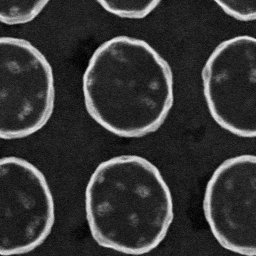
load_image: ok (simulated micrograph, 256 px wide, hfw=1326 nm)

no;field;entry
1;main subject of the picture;raised bodies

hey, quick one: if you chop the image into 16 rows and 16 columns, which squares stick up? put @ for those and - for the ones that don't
@@-----@@-----@@
----------------
---------------@
@@----@@@@---@@@
@@@--@@@@@---@@@
@@@--@@@@@@--@@@
@@@---@@@@---@@@
@@@---@@@@----@@
----------------
----------------
@@----@@@-----@@
@@@---@@@@---@@@
@@@---@@@@@--@@@
@@@---@@@@@--@@@
@@@---@@@@---@@@
@@-----@@------@